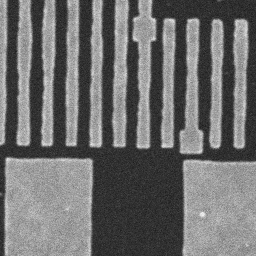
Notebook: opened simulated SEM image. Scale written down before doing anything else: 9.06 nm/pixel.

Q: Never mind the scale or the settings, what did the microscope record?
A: wiring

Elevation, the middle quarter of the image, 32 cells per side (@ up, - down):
-@@----@@----@@----@@----@@----@
-@@----@@----@@----@@----@@----@
-@@----@@----@@----@@----@@----@
-@@----@@----@@----@@----@@----@
-@@----@@----@@----@@----@@----@
-@@----@@----@@----@@----@@----@
-@@----@@----@@----@@----@@----@
-@@----@@----@@----@@----@@----@
-@@----@@----@@----@@----@@----@
-@@----@@----@@----@@----@@----@
-@@----@@----@@----@@----@@----@
-@@----@@----@@----@@----@@----@
-@@----@@----@@----@@----@@----@
-@@----@@----@@----@@----@@----@
-@@----@@----@@----@@----@@----@
-@@----@@----@@----@@----@@----@
-@@----@@----@@----@@----@@---@@
-@@----@@----@@----@@----@@--@@@
-@@----@@----@@----@@----@@--@@@
-@@----@@----@@----@@----@@--@@@
-------------------@@----@@--@@@
-----------------------------@@@
--------------------------------
--------------------------------
@@@@@@@-----------------------@@
@@@@@@@-----------------------@@
@@@@@@@-----------------------@@
@@@@@@@-----------------------@@
@@@@@@@-----------------------@@
@@@@@@@-----------------------@@
@@@@@@@-----------------------@@
@@@@@@@-----------------------@@